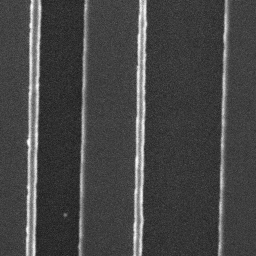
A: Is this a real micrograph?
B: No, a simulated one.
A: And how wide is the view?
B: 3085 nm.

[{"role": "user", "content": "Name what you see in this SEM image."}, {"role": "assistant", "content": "lines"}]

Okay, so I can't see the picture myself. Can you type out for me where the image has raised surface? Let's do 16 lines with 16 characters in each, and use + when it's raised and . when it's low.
+++..++++.....++
++...++++.....++
++...++++.....++
++...++++.....++
++...++++.....++
++...++++.....++
++...++++.....++
++...++++.....++
++...++++.....++
++...++++.....++
++...++++.....++
++...++++.....++
++...++++.....++
++...++++.....++
++...++++.....++
++...++++.....++